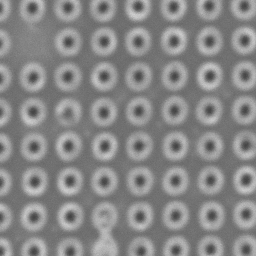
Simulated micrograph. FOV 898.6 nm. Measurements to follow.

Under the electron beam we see a regular array of ring-shaped raised bodies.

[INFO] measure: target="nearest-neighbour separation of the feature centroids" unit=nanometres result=121